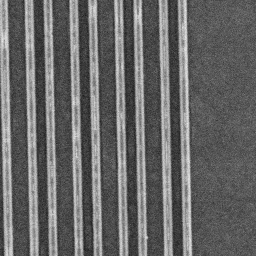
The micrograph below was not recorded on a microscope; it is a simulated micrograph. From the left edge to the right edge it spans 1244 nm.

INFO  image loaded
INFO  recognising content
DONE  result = parallel lines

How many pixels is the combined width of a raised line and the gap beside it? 22.3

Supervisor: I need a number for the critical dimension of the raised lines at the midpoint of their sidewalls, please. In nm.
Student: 34